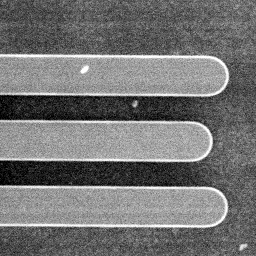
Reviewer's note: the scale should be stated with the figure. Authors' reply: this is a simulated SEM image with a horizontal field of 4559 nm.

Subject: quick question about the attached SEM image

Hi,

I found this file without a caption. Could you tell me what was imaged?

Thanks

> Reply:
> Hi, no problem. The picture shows groups of lines, slits or small figures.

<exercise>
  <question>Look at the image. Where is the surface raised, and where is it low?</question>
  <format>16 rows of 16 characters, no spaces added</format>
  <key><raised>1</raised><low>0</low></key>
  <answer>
0000000000000000
0000000000000000
0000000000000000
1111111000000000
1111111111111100
1111111111111100
0000000000000000
0000000000000000
1111111111111000
1111111111111000
0000000000000000
0000000000000000
1111111111111100
1111111111111100
0000000000000000
0000000000000000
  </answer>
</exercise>